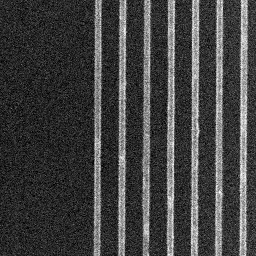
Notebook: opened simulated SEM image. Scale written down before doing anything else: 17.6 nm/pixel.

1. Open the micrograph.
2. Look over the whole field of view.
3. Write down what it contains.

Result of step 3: parallel lines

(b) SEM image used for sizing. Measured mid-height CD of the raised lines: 0.0992 microns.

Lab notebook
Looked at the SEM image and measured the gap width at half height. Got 333 nm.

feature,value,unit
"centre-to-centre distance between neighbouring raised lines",429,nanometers